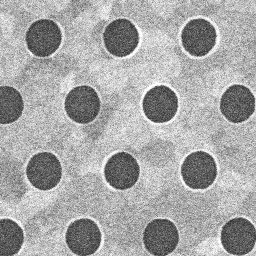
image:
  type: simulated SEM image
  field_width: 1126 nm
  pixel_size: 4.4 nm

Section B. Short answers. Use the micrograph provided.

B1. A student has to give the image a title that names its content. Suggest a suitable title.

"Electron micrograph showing a regular array of holes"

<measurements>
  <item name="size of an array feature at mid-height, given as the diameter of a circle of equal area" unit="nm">167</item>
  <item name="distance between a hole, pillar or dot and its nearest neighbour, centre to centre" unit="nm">339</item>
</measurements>